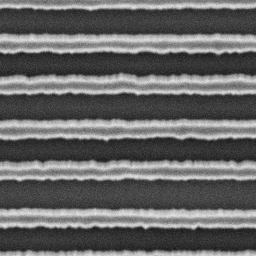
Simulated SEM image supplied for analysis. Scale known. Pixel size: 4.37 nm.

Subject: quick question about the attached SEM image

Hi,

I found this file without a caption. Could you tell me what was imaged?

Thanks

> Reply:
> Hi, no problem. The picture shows lines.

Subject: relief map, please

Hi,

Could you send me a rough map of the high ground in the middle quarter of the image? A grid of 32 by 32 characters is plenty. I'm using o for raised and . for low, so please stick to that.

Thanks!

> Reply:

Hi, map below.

................................
................................
................................
.oo.........ooooo............oo.
oooooooooooooooooooooooooooooooo
oooooooooooooooooooooooooooooooo
oooooooooooooooooooooooooooooooo
..................o.............
................................
................................
................................
................................
................................
................................
..............................o.
oooooooooooooooooooooooooooooooo
oooooooooooooooooooooooooooooooo
oooooooooooooooooooooooooooooooo
o..oooo.oooooo..............oo..
................................
................................
................................
................................
................................
................................
oooooooooooooooooooooooooooooooo
oooooooooooooooooooooooooooooooo
oooooooooooooooooooooooooooooooo
ooooooooooooooo...o.oooooooooooo
................................
................................
................................